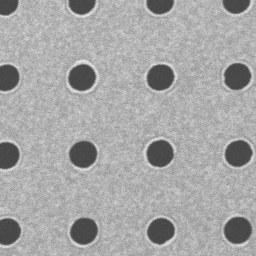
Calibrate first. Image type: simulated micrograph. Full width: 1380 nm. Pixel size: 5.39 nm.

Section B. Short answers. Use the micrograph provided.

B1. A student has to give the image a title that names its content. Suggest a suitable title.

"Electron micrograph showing a regular array of holes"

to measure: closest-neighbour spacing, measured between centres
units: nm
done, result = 414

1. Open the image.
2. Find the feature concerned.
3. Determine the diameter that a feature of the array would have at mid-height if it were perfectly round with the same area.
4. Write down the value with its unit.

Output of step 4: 146 nm